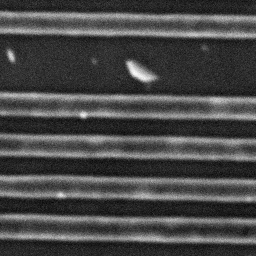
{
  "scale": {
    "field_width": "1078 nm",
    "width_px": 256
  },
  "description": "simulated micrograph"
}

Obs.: wiring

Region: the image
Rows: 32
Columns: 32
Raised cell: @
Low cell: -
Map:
--------------------------------
--------------------------------
@@@@@@@@@@@@@@@@@@@@@@@@@@@@@@@@
@@@@@@@@@@@@@@@@@@@@@@@@@@@@@@@@
---------------------------@@@@@
--------------------------------
--------------------------------
--------------------------------
----------------@---------------
-----------------@@-------------
--------------------------------
--------------------------------
@@@@@@@@@@@@@@@@@@@@@@@@@@@@@@@@
@@@@@@@@@@@@@@@@@@@@@@@@@@@@@@@@
----------@---@@@@@@@@@@@@@@@@@@
--------------------------------
--------------------------------
@@@@@@@@@@@@@@@@@@@@@@@@@@@@----
@@@@@@@@@@@@@@@@@@@@@@@@@@@@@@@@
----------@@@-@@@@@@@@@@@@@@@@@@
--------------------------------
--------------------------------
@@@@@@@@@@@@@@@@@@@@@@@---------
@@@@@@@@@@@@@@@@@@@@@@@@@@@@@@@@
---@@@@@@@@@@@@@@@@@@@@@@@@@@@@@
--------------------------------
--------------------------------
@@@@@@@@@@@@@@@@@@@@@@@@@@@@@@--
@@@@@@@@@@@@@@@@@@@@@@@@@@@@@@@@
@@@@@@@@@@@@@@@@@@@@@@@@@@@@@@@@
--------------------------------
--------------------------------